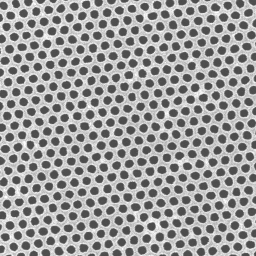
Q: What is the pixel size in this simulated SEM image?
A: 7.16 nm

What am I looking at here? a regular array of holes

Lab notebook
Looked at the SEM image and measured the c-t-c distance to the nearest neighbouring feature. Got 87.2 nanometres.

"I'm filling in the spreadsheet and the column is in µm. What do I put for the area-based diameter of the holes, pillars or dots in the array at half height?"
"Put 0.062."